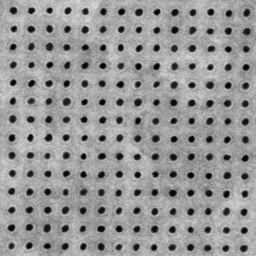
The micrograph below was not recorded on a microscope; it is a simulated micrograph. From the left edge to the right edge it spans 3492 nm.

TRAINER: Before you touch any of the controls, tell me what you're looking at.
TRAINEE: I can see a regular array of holes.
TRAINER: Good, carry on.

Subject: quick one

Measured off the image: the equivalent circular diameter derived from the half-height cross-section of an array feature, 103 nm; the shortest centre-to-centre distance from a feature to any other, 240 nm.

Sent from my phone